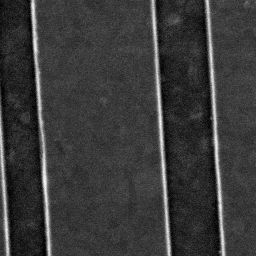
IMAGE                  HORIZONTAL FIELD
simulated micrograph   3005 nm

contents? one or a few lines or trenches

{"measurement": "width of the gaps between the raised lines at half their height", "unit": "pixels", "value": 53.9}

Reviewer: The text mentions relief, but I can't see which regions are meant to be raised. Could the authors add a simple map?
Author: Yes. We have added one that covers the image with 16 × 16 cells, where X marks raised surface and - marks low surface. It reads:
--XXXXXXXX---XXX
--XXXXXXXX---XXX
--XXXXXXXX---XXX
--XXXXXXXX---XXX
--XXXXXXXX---XXX
--XXXXXXXX---XXX
--XXXXXXXX---XXX
---XXXXXXX---XXX
---XXXXXXX---XXX
---XXXXXXX----XX
---XXXXXXX----XX
---XXXXXXX----XX
---XXXXXXX----XX
---XXXXXXX----XX
---XXXXXXX----XX
---XXXXXXXX---XX